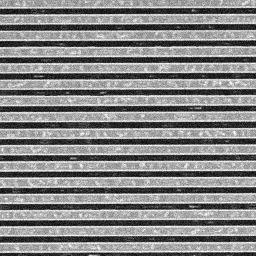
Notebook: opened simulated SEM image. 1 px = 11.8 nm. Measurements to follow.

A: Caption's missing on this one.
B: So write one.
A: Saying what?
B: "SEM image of parallel lines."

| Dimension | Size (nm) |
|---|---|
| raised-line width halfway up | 110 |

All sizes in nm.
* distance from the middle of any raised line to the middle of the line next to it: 193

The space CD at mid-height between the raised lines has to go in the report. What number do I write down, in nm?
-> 77